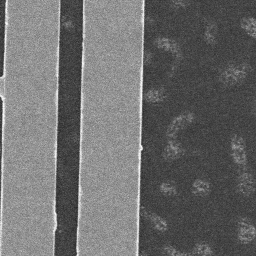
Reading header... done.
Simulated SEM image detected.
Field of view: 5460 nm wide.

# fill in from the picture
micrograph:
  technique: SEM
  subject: one or a few lines or trenches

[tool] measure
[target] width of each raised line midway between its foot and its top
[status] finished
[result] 59.4 px